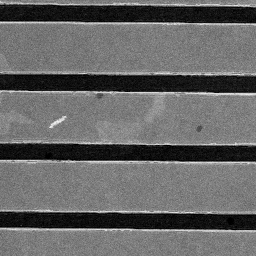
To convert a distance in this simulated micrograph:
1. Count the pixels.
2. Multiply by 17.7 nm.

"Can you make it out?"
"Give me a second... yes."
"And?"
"lines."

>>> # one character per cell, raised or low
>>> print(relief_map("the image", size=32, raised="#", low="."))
...#############################
................................
................................
################################
################################
################################
################################
################################
################################
................................
................................
###############.................
################################
################################
################################
################################
################################
################################
................................
................................
################################
################################
################################
################################
################################
################################
.......#########################
................................
................................
################################
################################
################################